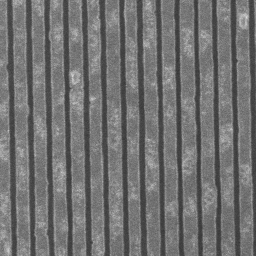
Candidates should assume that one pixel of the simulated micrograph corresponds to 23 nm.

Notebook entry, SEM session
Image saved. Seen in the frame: parallel lines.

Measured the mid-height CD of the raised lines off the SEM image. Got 296 nm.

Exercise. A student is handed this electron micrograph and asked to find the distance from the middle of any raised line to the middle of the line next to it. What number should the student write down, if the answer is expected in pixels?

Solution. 18.6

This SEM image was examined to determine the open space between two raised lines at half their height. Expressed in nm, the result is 138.